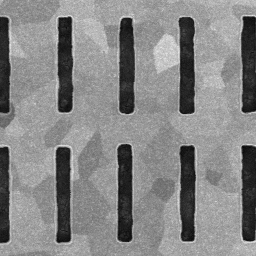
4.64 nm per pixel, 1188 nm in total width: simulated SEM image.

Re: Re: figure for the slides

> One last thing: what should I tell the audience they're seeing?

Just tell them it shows holes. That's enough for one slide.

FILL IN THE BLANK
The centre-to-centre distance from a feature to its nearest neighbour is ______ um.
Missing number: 0.285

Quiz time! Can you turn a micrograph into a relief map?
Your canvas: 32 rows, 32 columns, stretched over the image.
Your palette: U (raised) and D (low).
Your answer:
UUUUUUUUUUUUUUUUUUUUUUUUUUUUUUUU
UUUUUUUUUUUUUUUUUUUUUUUUUUUUUUUU
DUUUUUUDDUUUUUUDDUUUUUDDUUUUUUDD
DUUUUUUDDUUUUUUDDUUUUUDDUUUUUUDD
DUUUUUUDDUUUUUUDDUUUUUDDUUUUUUDD
DUUUUUUDDUUUUUUDDUUUUUDDUUUUUUDD
DUUUUUUDDUUUUUUDDUUUUUDDUUUUUUDD
DUUUUUUDDUUUUUUDDUUUUUDDUUUUUUDD
DUUUUUUDDUUUUUUDDUUUUUDDUUUUUUDD
DUUUUUUDDUUUUUUDDUUUUUDDUUUUUUDD
DUUUUUUDDUUUUUUDDUUUUUDDUUUUUUDD
DUUUUUUDDUUUUUUDDUUUUUDDUUUUUUDD
DUUUUUUDDUUUUUUDDUUUUUDDUUUUUUDD
DUUUUUUDDUUUUUUDDUUUUUDDUUUUUUDD
UUUUUUUUUUUUUUUUUUUUUUUUUUUUUUUU
UUUUUUUUUUUUUUUUUUUUUUUUUUUUUUUU
UUUUUUUUUUUUUUUUUUUUUUUUUUUUUUUU
UUUUUUUUUUUUUUUUUUUUUUUUUUUUUUUU
DUUUUUUDDUUUUUUDUUUUUUUDUUUUUUDD
DUUUUUUDDUUUUUUDDUUUUUDDUUUUUUDD
DUUUUUUDDUUUUUUDDUUUUUDDUUUUUUDD
DUUUUUUDDUUUUUUDDUUUUUDDDUUUUUDD
DUUUUUUDDUUUUUUDDUUUUUDDDUUUUUDD
DUUUUUUDDUUUUUUDDUUUUUDDDUUUUUDD
DUUUUUUDDUUUUUUDDUUUUUDDDUUUUUDD
DUUUUUUDDUUUUUUDDUUUUUDDUUUUUUDD
DUUUUUUDDUUUUUUDDUUUUUDDUUUUUUDD
DUUUUUUDDUUUUUUDDUUUUUUDUUUUUUDD
DUUUUUUDDUUUUUUDDUUUUUUDUUUUUUDD
DUUUUUUDDUUUUUUDDUUUUUUDUUUUUUDD
DUUUUUUUUUUUUUUUUUUUUUUUUUUUUUUU
UUUUUUUUUUUUUUUUUUUUUUUUUUUUUUUU